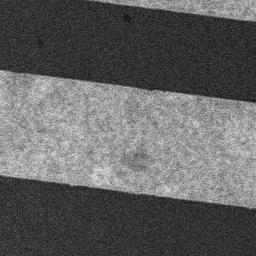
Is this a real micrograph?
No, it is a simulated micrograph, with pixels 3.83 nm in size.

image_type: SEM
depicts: one or a few lines or trenches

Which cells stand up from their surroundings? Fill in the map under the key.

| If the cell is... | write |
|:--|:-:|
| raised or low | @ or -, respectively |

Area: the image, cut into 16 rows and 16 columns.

----------@@@@@@
----------------
----------------
----------------
@---------------
@@@@@@@@--------
@@@@@@@@@@@@@@@@
@@@@@@@@@@@@@@@@
@@@@@@@@@@@@@@@@
@@@@@@@@@@@@@@@@
@@@@@@@@@@@@@@@@
-----@@@@@@@@@@@
-------------@@@
----------------
----------------
----------------